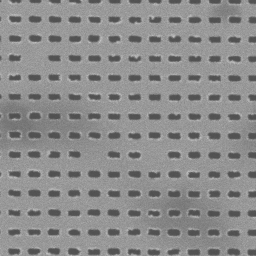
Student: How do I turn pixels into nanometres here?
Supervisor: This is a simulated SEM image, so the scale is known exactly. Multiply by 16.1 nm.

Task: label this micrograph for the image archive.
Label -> a regular array of holes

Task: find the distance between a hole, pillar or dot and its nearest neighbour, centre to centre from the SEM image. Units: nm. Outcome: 307